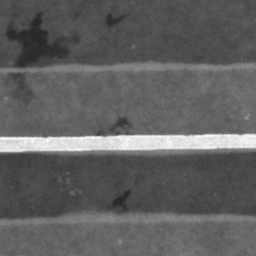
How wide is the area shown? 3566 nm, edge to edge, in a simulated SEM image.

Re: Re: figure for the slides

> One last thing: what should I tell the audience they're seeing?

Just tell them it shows lines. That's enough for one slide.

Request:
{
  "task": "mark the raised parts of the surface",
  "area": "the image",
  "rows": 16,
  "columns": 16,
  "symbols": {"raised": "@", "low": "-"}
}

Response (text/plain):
----------------
----------------
----------------
----------------
@@@@@@@@@@@@@@@@
@@@@@@@@@@@@@@@@
@@@@@@@@@@@@@@@@
@@@@@@@@@@@@@@@@
@@@@@@@@@@@@@@@@
----------------
----------------
----------------
----------------
----------------
@@@@@@@@@@@@@@@@
@@@@@@@@@@@@@@@@